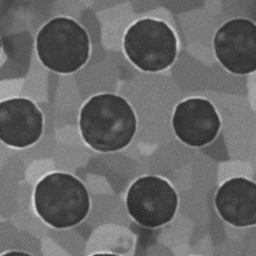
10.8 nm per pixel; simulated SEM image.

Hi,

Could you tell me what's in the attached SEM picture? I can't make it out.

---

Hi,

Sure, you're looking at holes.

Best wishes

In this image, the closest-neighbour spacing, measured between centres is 957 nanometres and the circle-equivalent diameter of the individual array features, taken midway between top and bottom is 584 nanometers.